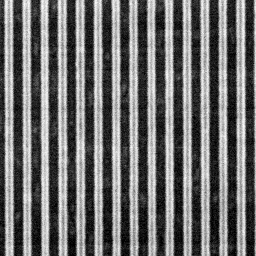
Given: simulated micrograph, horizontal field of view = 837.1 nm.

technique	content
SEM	parallel lines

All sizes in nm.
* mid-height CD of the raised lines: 20.4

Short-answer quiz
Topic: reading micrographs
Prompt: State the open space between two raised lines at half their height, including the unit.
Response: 0.0371 micrometres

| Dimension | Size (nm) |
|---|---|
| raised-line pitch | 58.2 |